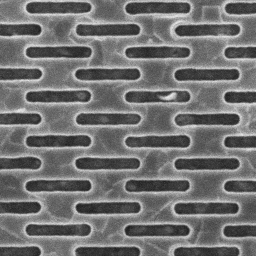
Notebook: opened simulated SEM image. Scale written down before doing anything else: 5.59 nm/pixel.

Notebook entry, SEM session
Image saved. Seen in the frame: a regular array of holes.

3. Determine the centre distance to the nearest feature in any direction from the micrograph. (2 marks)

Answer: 248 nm